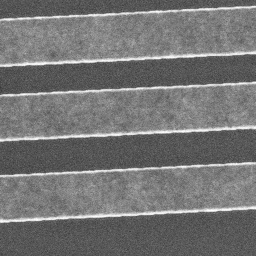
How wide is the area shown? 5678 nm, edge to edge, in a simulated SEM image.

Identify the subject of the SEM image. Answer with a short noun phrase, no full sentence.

lines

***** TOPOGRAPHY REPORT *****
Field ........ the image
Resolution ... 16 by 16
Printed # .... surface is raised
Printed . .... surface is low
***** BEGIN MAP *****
..............##
################
################
#############...
................
.........#######
################
################
#######.........
................
..........######
################
################
########........
................
................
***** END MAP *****